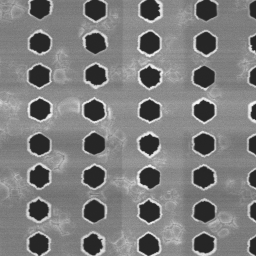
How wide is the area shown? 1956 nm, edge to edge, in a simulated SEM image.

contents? a regular array of holes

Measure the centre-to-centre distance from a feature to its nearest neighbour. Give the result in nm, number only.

254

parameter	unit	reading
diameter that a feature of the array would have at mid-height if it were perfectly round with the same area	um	0.155